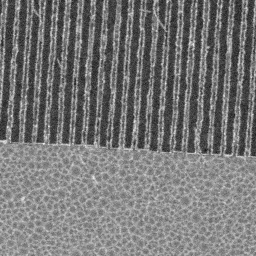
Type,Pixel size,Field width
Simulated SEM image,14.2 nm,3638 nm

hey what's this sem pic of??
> parallel lines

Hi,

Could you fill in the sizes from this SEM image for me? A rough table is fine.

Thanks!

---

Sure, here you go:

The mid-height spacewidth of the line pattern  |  0.0479 µm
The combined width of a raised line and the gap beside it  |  179 nm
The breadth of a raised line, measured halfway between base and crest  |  0.131 micrometres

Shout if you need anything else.